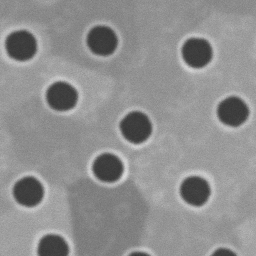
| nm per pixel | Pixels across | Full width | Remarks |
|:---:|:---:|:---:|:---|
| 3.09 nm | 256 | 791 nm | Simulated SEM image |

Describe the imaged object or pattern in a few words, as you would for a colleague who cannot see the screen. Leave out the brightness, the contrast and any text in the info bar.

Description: a regular array of holes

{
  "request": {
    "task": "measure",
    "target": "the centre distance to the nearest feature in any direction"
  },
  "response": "0.212 um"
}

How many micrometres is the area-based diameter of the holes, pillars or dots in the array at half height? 0.102